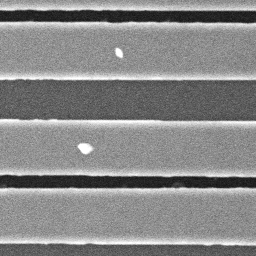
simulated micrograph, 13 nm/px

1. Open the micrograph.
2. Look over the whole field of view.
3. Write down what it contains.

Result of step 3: lines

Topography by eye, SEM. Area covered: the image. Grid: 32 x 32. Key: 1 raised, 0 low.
11111111111111111111111111111111
00000000000000000000000000000000
00000000000000000000000000000000
11111111111111111111111111111111
11111111111111111111111111111111
11111111111111111111111111111111
11111111111111111111111111111111
11111111111111111111111111111111
11111111111111111111111111111111
11111111111111111111111111111111
00000000000000000000000000000000
00000000000000000000000000000000
00000000000000000000000000000000
00000000000000000000000000000000
00000000000000000000000000000000
11111111111111111111111111111111
11111111111111111111111111111111
11111111111111111111111111111111
11111111111111111111111111111111
11111111111111111111111111111111
11111111111111111111111111111111
11111111111111111111111111111111
00000000000000000000000000000000
00000000000000000000000000000000
11111111111111111111111111111111
11111111111111111111111111111111
11111111111111111111111111111111
11111111111111111111111111111111
11111111111111111111111111111111
11111111111111111111111111111111
00000000000000000000000001111111
00000000000000000000000000000000